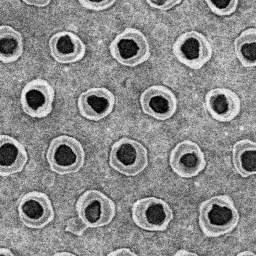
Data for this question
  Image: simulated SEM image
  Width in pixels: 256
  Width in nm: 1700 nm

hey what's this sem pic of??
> a regular array of ring-shaped raised bodies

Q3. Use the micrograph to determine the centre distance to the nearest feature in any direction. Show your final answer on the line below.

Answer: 0.39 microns